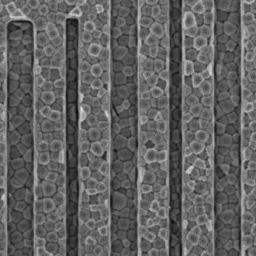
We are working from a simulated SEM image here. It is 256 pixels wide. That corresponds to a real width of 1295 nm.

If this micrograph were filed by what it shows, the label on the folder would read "parallel lines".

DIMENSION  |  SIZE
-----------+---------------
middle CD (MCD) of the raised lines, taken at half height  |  161 nm